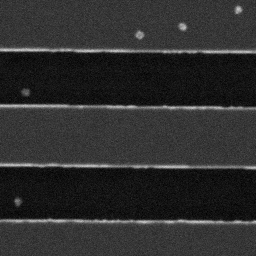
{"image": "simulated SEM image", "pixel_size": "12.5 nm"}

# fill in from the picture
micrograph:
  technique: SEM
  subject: lines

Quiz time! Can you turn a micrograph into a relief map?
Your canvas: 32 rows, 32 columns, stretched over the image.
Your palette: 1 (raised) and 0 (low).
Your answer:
11111111111111111111111111111111
11111111111111111111111111111111
11111111111111111111111111111111
11111111111111111111111111111111
11111111111111111111111111111111
11111111111111111111111111111111
00000000000000000000101111111111
00000000000000000000000000000000
00000000000000000000000000000000
00000000000000000000000000000000
00000000000000000000000000000000
00000000000000000000000000000000
00000000000000000000000000000000
11111111111111111111111111111110
11111111111111111111111111111111
11111111111111111111111111111111
11111111111111111111111111111111
11111111111111111111111111111111
11111111111111111111111111111111
11111111111111111111111111111111
11111111111111111111111111111111
00000000000000000000000000000000
00000000000000000000000000000000
00000000000000000000000000000000
00000000000000000000000000000000
00000000000000000000000000000000
00000000000000000000000000000000
00000000000000000000000000000000
11111111111111111111111111111111
11111111111111111111111111111111
11111111111111111111111111111111
11111111111111111111111111111111